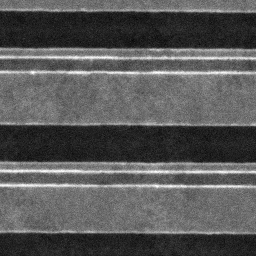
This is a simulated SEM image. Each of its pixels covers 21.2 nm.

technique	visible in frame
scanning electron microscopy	lines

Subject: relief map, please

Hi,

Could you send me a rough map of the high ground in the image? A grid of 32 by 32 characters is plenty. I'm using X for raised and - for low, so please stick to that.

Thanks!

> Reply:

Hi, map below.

XXXXXXXXXXXXXXXXXXXXXXXXXXXXXXXX
--------------------------------
--------------------------------
--------------------------------
--------------------------------
--------------------------------
XXXXXXXXXXXXXXXXXXXXXXXXXXXXXXXX
XXXXXXXXXXXXXXXXXXXXXXXXXXXXXXXX
XXXXXXXXXXXXXXXXXXXXXXXXXXXXXXXX
XXXXXXXXXXXXXXXXXXXXXXXXXXXXXXXX
XXXXXXXXXXXXXXXXXXXXXXXXXXXXXXXX
XXXXXXXXXXXXXXXXXXXXXXXXXXXXXXXX
XXXXXXXXXXXXXXXXXXXXXXXXXXXXXXXX
XXXXXXXXXXXXXXXXXXXXXXXXXXXXXXXX
XXXXXXXXXXXXXXXXXXXXXXXXXXXXXXXX
-XXXXXXXXXXXXXXXXXXXXXXXXXXXXXXX
--------------------------------
--------------------------------
--------------------------------
--------------------------------
XXXXXXXXXXXXXXXXXXXXXXXXXXXXXXXX
XXXXXXXXXXXXXXXXXXXXXXXXXXXXXXXX
XXXXXXXXXXXXXXXXXXXXXXXXXXXXXXXX
XXXXXXXXXXXXXXXXXXXXXXXXXXXXXXXX
XXXXXXXXXXXXXXXXXXXXXXXXXXXXXXXX
XXXXXXXXXXXXXXXXXXXXXXXXXXXXXXXX
XXXXXXXXXXXXXXXXXXXXXXXXXXXXXXXX
XXXXXXXXXXXXXXXXXXXXXXXXXXXXXXXX
XXXXXXXXXXXXXXXXXXXXXXXXXXXXXXXX
--------------------------------
--------------------------------
--------------------------------